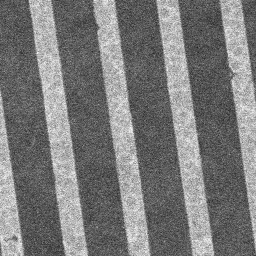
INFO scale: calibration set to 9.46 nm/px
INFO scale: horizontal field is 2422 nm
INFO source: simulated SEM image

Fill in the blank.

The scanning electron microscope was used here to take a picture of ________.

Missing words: one or a few lines or trenches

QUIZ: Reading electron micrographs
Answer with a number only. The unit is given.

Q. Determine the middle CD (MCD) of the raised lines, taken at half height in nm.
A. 191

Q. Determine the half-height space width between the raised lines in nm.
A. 399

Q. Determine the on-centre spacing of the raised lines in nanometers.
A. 588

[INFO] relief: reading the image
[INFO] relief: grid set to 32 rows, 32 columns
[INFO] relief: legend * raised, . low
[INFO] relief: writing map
....**......**......**......**..
....***.....**......**......**..
....***.....**......***.....**..
....***.....***.....***.....***.
....***.....***.....***.....***.
.....**......**.....***.....***.
.....**......**......**......**.
.....**......**......**......**.
.....***.....**......**......**.
.....***.....***.....***.....**.
.....***.....***.....***.....***
.....***.....***.....***.....***
......**.....***.....***.....***
......**......**.....***.....***
......**......**......**......**
*.....***.....**......**......**
*.....***.....*.......***.....**
*.....***.....***.....***.....**
*.....***.....***.....***.....**
*......**......**.....***.....**
*......**......**......**.....**
*......**......**......**......*
**.....***.....**......**......*
**.....***.....***.....***.....*
**.....***.....***.....***.....*
**.....***.....***.....***.....*
**.....***.....***.....***.....*
**......**......**......**.....*
**......**......**......**......
*.......***.....**......**......
**......***.....***.....***.....
***.....***.....***.....***.....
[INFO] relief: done